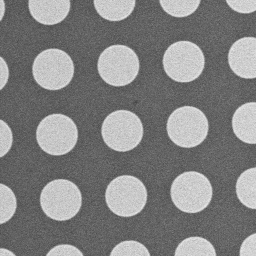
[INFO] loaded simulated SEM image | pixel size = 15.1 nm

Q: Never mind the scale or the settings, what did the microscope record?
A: an array of small figures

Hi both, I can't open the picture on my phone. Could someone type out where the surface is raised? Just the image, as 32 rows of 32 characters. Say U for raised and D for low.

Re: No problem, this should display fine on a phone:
UDDDUUUUUDDDUUUUUDDDUUUUUDDDDUUU
UDDDUUUUUDDDUUUUDDDDDUUUDDDDDDUD
DDDDDUUUDDDDDDUDDDDDDDDDDDDDDDDD
DDDDDDDDDDDDDDDDDDDDDDDDDDDDDDDD
DDDDDDDDDDDDDDDDDDDDDDDDDDDDDDDD
DDDDDDDDDDDDDDDDDDDDDDUUDDDDDUUU
DDDDDUUUDDDDDUUUUDDDDUUUUDDDDUUU
DDDDUUUUUDDDUUUUUDDDUUUUUUDDDUUU
UDDDUUUUUDDDUUUUUDDDDUUUUDDDDUUU
UDDDUUUUUDDDDUUUUDDDDUUUUDDDDDUU
UDDDDUUUDDDDDDUUDDDDDDDDDDDDDDDD
DDDDDDDDDDDDDDDDDDDDDDDDDDDDDDDD
DDDDDDDDDDDDDDDDDDDDDDDDDDDDDDDD
DDDDDDDDDDDDDDDDDDDDDDUUDDDDDDUU
DDDDDDUUDDDDDUUUUDDDDUUUUUDDDUUU
UDDDDUUUUDDDDUUUUUDDDUUUUUDDDUUU
UDDDDUUUUUDDDUUUUUDDDUUUUUDDDUUU
UUDDDUUUUUDDDUUUUUDDDDUUUDDDDDUU
UDDDDUUUUDDDDDUUUDDDDDDDDDDDDDDD
DDDDDDDDDDDDDDDDDDDDDDDDDDDDDDDD
DDDDDDDDDDDDDDDDDDDDDDDDDDDDDDDD
DDDDDDDDDDDDDDDDDDDDDDDUDDDDDDUU
DDDDDDDUDDDDDDUUUDDDDDUUUUDDDDUU
UDDDDDUUUUDDDUUUUUDDDUUUUUDDDDUU
UUDDDUUUUUDDDUUUUUDDDUUUUUDDDDUU
UUDDDUUUUUDDDUUUUUDDDDUUUUDDDDUU
UUDDDDUUUUDDDDUUUDDDDDDUUDDDDDDD
UDDDDDDUDDDDDDDDDDDDDDDDDDDDDDDD
DDDDDDDDDDDDDDDDDDDDDDDDDDDDDDDD
DDDDDDDDDDDDDDDDDDDDDDDDDDDDDDDU
DDDDDDDDDDDDDDDUUUDDDDUUUUDDDDUU
UDDDDDUUUUDDDDUUUUUDDDUUUUUDDDUU